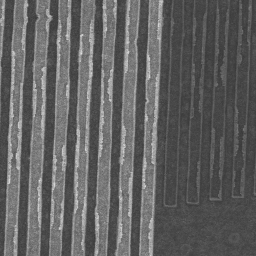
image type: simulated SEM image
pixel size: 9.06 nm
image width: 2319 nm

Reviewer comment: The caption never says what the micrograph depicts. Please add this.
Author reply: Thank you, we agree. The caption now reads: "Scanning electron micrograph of parallel lines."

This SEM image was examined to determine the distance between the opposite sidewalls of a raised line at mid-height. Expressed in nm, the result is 108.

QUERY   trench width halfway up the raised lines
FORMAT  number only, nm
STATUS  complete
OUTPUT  99.6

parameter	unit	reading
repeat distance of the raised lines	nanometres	204